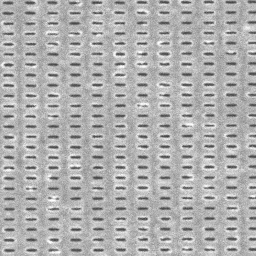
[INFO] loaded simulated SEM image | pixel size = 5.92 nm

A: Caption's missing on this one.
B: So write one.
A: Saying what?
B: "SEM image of a regular array of holes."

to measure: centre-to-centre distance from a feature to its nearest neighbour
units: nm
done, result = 59.6